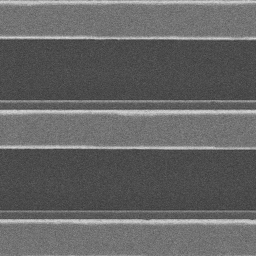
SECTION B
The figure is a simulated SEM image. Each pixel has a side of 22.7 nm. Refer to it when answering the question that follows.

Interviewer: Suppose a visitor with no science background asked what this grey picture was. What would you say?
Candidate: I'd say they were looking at lines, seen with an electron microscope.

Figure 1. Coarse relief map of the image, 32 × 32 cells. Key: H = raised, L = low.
HHHHHHHHHHHHHHHHHHHHHHHHHHHHHHHH
HHHHHHHHHHHHHHHHHHHHHHHHHHHHHHHH
HHHHHHHHHHHHHHHHHHHHHHHHHHHHHHHH
HHHHHHHHHHHHHHHHHHHHHHHHHHHHHHHH
HHHHHHHHHHHHHHHHHHHHHHHHHHHHHHHH
LLLLLLLLLLLLLLLLLLLLLLLLLLLLLLLL
LLLLLLLLLLLLLLLLLLLLLLLLLLLLLLLL
LLLLLLLLLLLLLLLLLLLLLLLLLLLLLLLL
LLLLLLLLLLLLLLLLLLLLLLLLLLLLLLLL
LLLLLLLLLLLLLLLLLLLLLLLLLLLLLLLL
LLLLLLLLLLLLLLLLLLLLLLLLLLLLLLLL
LLLLLLLLLLLLLLLLLLLLLLLLLLLLLLLL
LLLLLLLLLLLLLLLLLLLLLLLLLLLLLLLL
LLLLLLLLLLLLLLLLLLLLLLLLLLLLLLLL
HHHHHHHHHHHHHHHHHHHHHHHHHHHHHHHH
HHHHHHHHHHHHHHHHHHHHHHHHHHHHHHHH
HHHHHHHHHHHHHHHHHHHHHHHHHHHHHHHH
HHHHHHHHHHHHHHHHHHHHHHHHHHHHHHHH
HHHHHHHHHHHHHHHHHHHHHHHHHHHHHHHH
LLLLLLLLLLLLLLLLLLLLLLLLLLLLLLLL
LLLLLLLLLLLLLLLLLLLLLLLLLLLLLLLL
LLLLLLLLLLLLLLLLLLLLLLLLLLLLLLLL
LLLLLLLLLLLLLLLLLLLLLLLLLLLLLLLL
LLLLLLLLLLLLLLLLLLLLLLLLLLLLLLLL
LLLLLLLLLLLLLLLLLLLLLLLLLLLLLLLL
LLLLLLLLLLLLLLLLLLLLLLLLLLLLLLLL
LLLLLLLLLLLLLLLLLLLLLLLLLLLLLLLL
HHHHHHHHHHHHHHHHHHHHHHHHHHHHHHHH
HHHHHHHHHHHHHHHHHHHHHHHHHHHHHHHH
HHHHHHHHHHHHHHHHHHHHHHHHHHHHHHHH
HHHHHHHHHHHHHHHHHHHHHHHHHHHHHHHH
HHHHHHHHHHHHHHHHHHHHHHHHHHHHHHHH